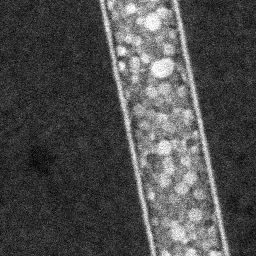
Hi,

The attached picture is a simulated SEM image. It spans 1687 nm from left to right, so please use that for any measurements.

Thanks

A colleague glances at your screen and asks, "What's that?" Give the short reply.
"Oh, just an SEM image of one or a few lines or trenches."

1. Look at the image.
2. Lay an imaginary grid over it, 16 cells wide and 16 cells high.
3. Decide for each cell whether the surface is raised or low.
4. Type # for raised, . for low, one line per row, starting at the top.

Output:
######.....#####
#######....#####
#######....#####
#######.....####
#######.....####
########....####
########....####
########....####
########.....###
########.....###
#########....###
#########....###
#########....###
#########.....##
#########.....##
##########....##